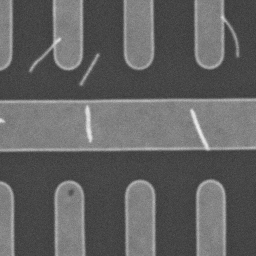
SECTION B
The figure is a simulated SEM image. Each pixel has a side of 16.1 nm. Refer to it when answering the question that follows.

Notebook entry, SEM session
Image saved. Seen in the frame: groups of lines, slits or small figures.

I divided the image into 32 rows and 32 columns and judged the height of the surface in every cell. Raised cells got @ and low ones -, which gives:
@------@@@------@@@-----@@@@----
@------@@@------@@@-----@@@@----
@------@@@------@@@-----@@@@----
@------@@@------@@@-----@@@@----
@------@@@------@@@------@@@----
@------@@@------@@@------@@@----
@------@@@------@@@------@@@----
@------@@@------@@@------@@@----
--------@--------@--------------
--------------------------------
--------------------------------
--------------------------------
--------------------------------
@@@@@@@@@@@@@@@@@@@@@@@@@@@@@@@@
@@@@@@@@@@@@@@@@@@@@@@@@@@@@@@@@
@@@@@@@@@@@@@@@@@@@@@@@@@@@@@@@@
@@@@@@@@@@@@@@@@@@@@@@@@@@@@@@@@
@@@@@@@@@@@@@@@@@@@@@@@@@@@@@@@@
@@@@@@@@@@@@@@@@@@@@@@@@@@@@@@@@
--------------------------------
--------------------------------
--------------------------------
--------------------------------
@------@@@------@@@------@@@----
@@-----@@@------@@@------@@@----
@@-----@@@------@@@------@@@----
@@-----@@@------@@@------@@@----
@@-----@@@------@@@------@@@----
@@-----@@@------@@@------@@@----
@@-----@@@------@@@------@@@----
@@-----@@@@-----@@@------@@@----
@@-----@@@@-----@@@------@@@----